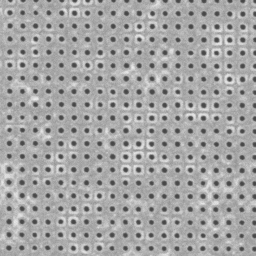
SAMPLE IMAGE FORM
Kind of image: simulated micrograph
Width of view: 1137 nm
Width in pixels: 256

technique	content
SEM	a regular array of holes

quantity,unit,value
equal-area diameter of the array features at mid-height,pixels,5.16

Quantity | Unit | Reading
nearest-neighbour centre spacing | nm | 56.7